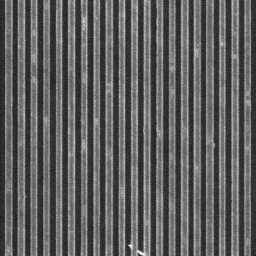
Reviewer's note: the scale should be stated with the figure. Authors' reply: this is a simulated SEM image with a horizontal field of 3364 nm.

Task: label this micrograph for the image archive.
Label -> parallel lines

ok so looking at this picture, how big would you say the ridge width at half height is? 65.7 nanometers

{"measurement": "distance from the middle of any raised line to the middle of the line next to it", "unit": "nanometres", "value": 165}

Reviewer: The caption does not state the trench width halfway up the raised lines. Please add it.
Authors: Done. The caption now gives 0.0903 um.